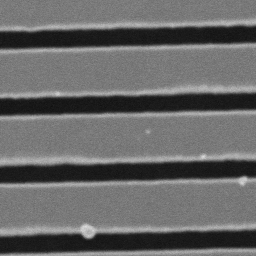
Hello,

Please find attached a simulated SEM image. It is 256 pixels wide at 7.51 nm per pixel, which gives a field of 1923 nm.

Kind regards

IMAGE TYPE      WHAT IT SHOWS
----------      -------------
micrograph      lines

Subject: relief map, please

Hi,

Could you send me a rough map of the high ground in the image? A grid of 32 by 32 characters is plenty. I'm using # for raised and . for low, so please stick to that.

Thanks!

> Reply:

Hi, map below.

################################
################################
################################
##############..................
................................
...............................#
################################
################################
################################
################################
################################
################################
................................
................................
################################
################################
################################
################################
################################
################################
#######.........................
................................
.....................###########
################################
################################
################################
################################
################################
################################
..........##....................
................................
.............###################